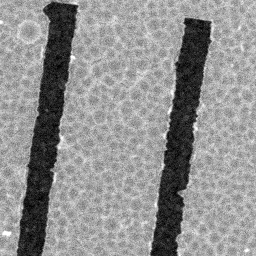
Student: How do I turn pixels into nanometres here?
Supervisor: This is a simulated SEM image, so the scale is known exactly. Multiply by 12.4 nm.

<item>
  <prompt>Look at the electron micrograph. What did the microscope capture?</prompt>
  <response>one or a few lines or trenches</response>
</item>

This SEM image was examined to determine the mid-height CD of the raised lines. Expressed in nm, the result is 338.